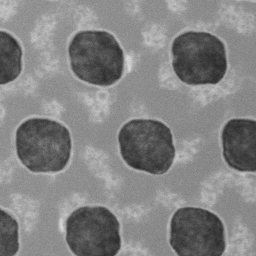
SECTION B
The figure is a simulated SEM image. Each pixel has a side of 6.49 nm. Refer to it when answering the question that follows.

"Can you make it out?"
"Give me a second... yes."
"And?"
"holes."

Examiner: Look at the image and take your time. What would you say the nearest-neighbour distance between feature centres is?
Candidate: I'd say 661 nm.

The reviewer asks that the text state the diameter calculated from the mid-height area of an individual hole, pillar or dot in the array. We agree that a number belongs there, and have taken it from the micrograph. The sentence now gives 0.37 um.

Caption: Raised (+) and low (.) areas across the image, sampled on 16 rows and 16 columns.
++++++++++++++++
++++++++++++++++
.+++...++++...++
.+++....+++...++
.++++...+++...++
++++++++++++++++
++++++++++++++++
++.+++++..++++..
+...+++....+++..
+...++++...+++..
++..++++...+++..
++++++++++++++++
++++++++++++++++
.+++...++++..+++
.+++...++++...++
.+++...++++...++